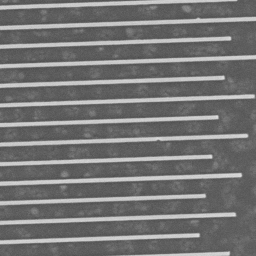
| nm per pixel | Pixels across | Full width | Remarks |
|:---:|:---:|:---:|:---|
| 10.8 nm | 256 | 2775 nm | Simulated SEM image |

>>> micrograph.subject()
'parallel lines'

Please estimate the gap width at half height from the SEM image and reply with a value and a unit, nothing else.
0.177 µm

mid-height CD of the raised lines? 32.5 nm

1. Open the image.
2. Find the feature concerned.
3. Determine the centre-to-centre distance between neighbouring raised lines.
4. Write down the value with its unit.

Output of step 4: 212 nm